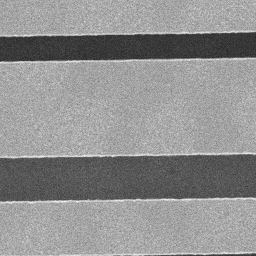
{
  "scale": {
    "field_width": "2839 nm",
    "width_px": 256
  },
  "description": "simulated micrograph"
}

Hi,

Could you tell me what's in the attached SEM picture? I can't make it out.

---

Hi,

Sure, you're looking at lines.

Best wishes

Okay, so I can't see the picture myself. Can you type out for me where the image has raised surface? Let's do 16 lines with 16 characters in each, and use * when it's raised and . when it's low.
****************
****************
................
................
****************
****************
****************
****************
****************
****************
................
................
..........******
****************
****************
****************